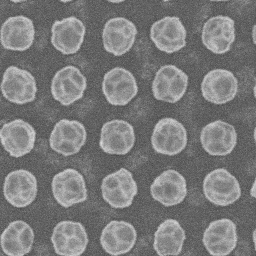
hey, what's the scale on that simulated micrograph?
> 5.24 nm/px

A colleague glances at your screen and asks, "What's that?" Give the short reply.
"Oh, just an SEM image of a regular array of raised bodies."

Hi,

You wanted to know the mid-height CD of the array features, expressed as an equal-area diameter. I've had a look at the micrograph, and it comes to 176 nm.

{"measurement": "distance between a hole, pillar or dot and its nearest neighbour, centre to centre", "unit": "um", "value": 0.261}